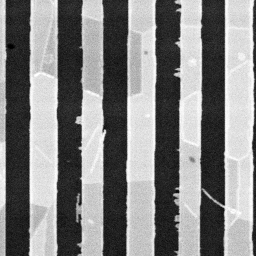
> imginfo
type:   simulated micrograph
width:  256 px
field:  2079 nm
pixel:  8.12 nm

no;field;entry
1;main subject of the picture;lines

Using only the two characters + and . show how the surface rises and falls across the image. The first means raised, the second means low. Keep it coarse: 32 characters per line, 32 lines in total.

+...+++...+++...+++....++...++++
+...+++...+++...+++....++...++++
+...+++...+++...+++....++...++++
+...+++...+++...+++....++...++++
+...+++...+++...+++....++...++++
+...+++...+++...+++....++...++++
+...+++...+++...+++....++...++++
+...+++...+++...+++....++...++++
+...+++...+++...+++....++...++++
+...+++...+++...+++....++...++++
+...+++...+++...+++....++...++++
+...+++...+++...+++....++...++++
+...+++...+++...+++....++...++++
+...+++...+++...+++....++...++++
+...+++...+++...+++....++...++++
+...+++...+++...+++....++...++++
+...+++...+++...+++....++...++++
+...+++...+++...+++....++...++++
+...+++...+++...+++....++...+++.
+...+++...+++...+++....++...++++
+...+++...+++...+++....++...++++
+...+++...+++...+++....++...++++
+...+++...+++...+++....++...++++
+...+++...+++...+++....++...++++
+...+++...+++...+++....++...++++
+...+++...+++...+++....++...++++
+...+++...+++...+++....++...++++
+...+++...+++...+++....++...++++
+...+++...+++...+++...+++...++++
+...+++...+++...+++...+++...+++.
+...+++...+++...+++...+++...++++
+...+++...+++...+++...+++...++++